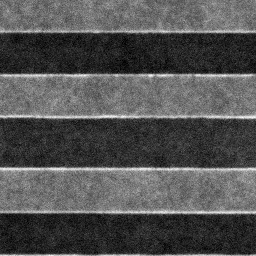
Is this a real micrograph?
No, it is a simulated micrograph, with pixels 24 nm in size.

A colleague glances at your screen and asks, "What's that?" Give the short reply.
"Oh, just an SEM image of lines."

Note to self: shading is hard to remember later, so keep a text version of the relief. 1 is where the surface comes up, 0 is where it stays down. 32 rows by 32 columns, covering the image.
11111111111111111111111111111111
11111111111111111111111111111111
11111111111111111111111111111111
11111111111111111111111111111111
00000000000000000000000000000000
00000000000000000000000000000000
00000000000000000000000000000000
00000000000000000000000000000000
00000000000000000000000000000000
11111111111111111111111111111111
11111111111111111111111111111111
11111111111111111111111111111111
11111111111111111111111111111111
11111111111111111111111111111111
11011111111111111111111111111111
00000000000000000000000000000000
00000000000000000000000000000000
00000000000000000000000000000000
00000000000000000000000000000000
00000000000000000000000000000000
00000000000000000000000000000000
11111111111111111111111111111111
11111111111111111111111111111111
11111111111111111111111111111111
11111111111111111111111111111111
11111111111111111111111111111111
00000000000000000000000000000000
00000000000000000000000000000000
00000000000000000000000000000000
00000000000000000000000000000000
00000000000000000000000000000000
00000000000000000000000000000000